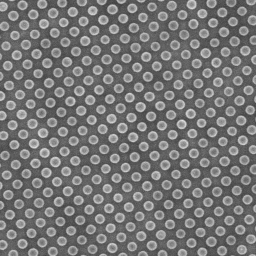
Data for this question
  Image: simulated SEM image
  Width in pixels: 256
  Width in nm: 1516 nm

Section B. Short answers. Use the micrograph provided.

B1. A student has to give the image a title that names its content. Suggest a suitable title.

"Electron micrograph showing a regular array of raised bodies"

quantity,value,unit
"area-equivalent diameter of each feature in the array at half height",55.1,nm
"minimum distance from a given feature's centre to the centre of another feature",81.6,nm